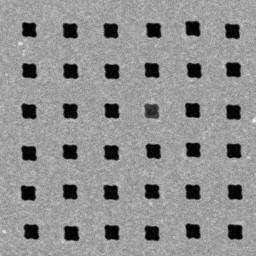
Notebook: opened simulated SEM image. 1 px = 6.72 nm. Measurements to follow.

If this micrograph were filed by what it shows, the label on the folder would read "a regular array of holes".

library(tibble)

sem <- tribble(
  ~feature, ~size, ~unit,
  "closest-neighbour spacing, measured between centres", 268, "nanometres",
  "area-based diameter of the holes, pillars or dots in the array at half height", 106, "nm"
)